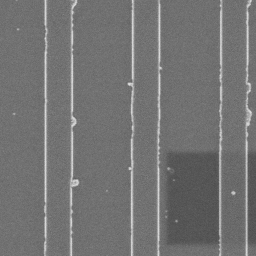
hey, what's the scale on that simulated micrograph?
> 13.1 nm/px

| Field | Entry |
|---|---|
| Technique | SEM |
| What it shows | lines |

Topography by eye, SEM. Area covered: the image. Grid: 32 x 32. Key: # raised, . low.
......###........###........###.
......###........###........###.
......###........###........###.
......###........###........###.
......###........###........###.
......###........###........###.
......###........###........###.
......###........###........###.
......###........###........###.
......###........###........###.
......###........###........###.
......###........###........###.
......###........###........###.
......###........###........###.
......###........###........###.
......###........###........###.
......###........###........###.
......###........###........###.
......###........###........###.
......###........###........###.
......###........###........###.
......###........###........###.
......###........###........###.
......###........###........###.
......###........###........###.
......###........###........###.
......###........###........###.
......###........###........###.
......###........###........###.
......###........###........###.
......###........###.......####.
......###........###.......####.